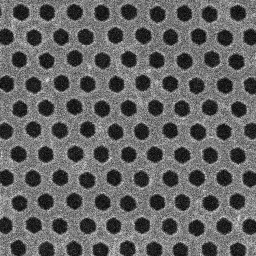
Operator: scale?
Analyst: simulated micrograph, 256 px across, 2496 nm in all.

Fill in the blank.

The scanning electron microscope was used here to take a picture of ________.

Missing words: a regular array of holes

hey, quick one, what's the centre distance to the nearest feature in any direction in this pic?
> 26.1 pixels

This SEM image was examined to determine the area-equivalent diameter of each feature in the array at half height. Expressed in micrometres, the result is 0.165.